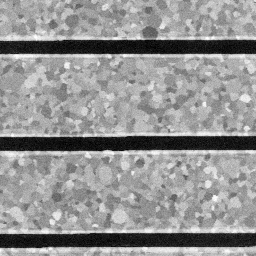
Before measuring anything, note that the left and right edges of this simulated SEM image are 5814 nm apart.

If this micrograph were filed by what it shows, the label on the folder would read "lines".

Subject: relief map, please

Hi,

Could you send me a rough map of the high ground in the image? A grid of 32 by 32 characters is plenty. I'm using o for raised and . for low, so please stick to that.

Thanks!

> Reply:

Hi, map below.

oooooooooooooooooooooooooooooooo
oooooooooooooooooooooooooooooooo
oooooooooooooooooooooooooooooooo
oooooooooooooooooooooooooooooooo
oooooooooooooooooooooooooooooooo
................................
................................
oooooooooooooooooooooooooooooooo
oooooooooooooooooooooooooooooooo
oooooooooooooooooooooooooooooooo
oooooooooooooooooooooooooooooooo
oooooooooooooooooooooooooooooooo
oooooooooooooooooooooooooooooooo
oooooooooooooooooooooooooooooooo
oooooooooooooooooooooooooooooooo
oooooooooooooooooooooooooooooooo
oooooooooooooooooooooooooooooooo
................................
................................
oooooooooooooooooooooooooooooooo
oooooooooooooooooooooooooooooooo
oooooooooooooooooooooooooooooooo
oooooooooooooooooooooooooooooooo
oooooooooooooooooooooooooooooooo
oooooooooooooooooooooooooooooooo
oooooooooooooooooooooooooooooooo
oooooooooooooooooooooooooooooooo
oooooooooooooooooooooooooooooooo
oooooooooooooooooooooooooooooooo
................................
................................
oooooooooooooooooooooooooooooooo